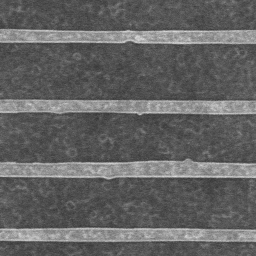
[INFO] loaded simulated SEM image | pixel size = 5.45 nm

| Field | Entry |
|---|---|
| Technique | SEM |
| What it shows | one or a few lines or trenches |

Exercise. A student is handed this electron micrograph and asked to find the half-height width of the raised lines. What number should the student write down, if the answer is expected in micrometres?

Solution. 0.0674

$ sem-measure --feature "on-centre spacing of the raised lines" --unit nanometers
360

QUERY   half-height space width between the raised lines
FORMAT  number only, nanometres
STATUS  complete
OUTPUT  285